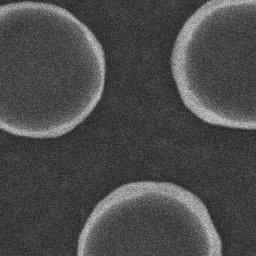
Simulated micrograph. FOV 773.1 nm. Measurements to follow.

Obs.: raised bodies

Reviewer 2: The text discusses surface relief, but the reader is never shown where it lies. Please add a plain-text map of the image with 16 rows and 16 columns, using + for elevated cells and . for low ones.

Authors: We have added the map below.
.++..........+++
+++++.......++++
++++++.....+++++
++++++.....+++++
++++++.....+++++
++++++.....+++++
++++++......++++
+++++.........++
................
................
................
................
.......+++++....
......+++++++...
.....++++++++...
.....+++++++++..